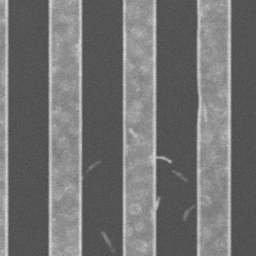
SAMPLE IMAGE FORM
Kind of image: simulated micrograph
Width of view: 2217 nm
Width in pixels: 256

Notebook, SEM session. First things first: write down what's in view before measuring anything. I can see one or a few lines or trenches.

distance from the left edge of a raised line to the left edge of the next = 644 nanometers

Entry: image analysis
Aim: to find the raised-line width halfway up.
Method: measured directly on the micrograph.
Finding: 272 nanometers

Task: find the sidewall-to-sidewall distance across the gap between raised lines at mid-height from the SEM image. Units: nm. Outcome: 376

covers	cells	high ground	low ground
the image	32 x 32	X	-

X-----XXXX------XXX------XXXX---
X-----XXXX------XXX------XXXX---
X-----XXXX------XXX------XXXX---
X-----XXXX------XXX------XXXX---
X-----XXXX------XXX------XXXX---
X-----XXXX------XXX------XXXX---
X-----XXXX------XXX------XXXX---
X-----XXXX------XXX------XXXX---
X-----XXXX------XXX------XXXX---
X-----XXXX------XXX------XXXX---
X-----XXXX------XXX------XXXX---
X-----XXXX------XXX------XXXX---
X-----XXXX------XXX------XXXX---
X-----XXXX------XXX------XXXX---
X-----XXXX------XXX------XXXX---
X-----XXXX------XXX------XXXX---
X-----XXXX------XXX------XXXX---
X-----XXXX------XXX------XXXX---
X-----XXXX------XXX------XXXX---
X-----XXXX------XXX------XXXX---
X-----XXXX------XXX------XXXX---
X-----XXXX------XXX------XXXX---
X-----XXXX------XXX------XXXX---
X-----XXXX------XXX------XXXX---
X-----XXXX------XXX------XXXX---
X-----XXXX------XXX------XXXX---
X-----XXXX------XXX------XXXX---
X-----XXXX------XXX------XXXX---
X-----XXXX------XXX------XXXX---
X-----XXXX------XXX------XXXX---
X-----XXXX------XXX------XXXX---
X-----XXXX------XXX------XXXX---